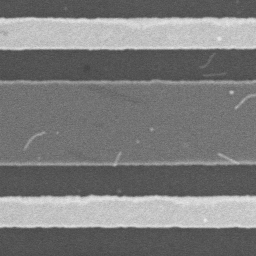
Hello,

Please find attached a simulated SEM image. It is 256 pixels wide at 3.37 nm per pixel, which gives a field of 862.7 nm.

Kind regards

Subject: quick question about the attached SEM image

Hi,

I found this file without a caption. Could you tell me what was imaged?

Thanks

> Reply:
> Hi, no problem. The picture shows lines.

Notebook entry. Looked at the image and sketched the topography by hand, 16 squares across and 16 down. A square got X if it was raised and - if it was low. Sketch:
----------------
XXXXXXXXXXXXXXXX
XXXXXXXXXXXXXXXX
----------------
----------------
XXXXXXXXXXXXXXXX
XXXXXXXXXXXXXXXX
XXXXXXXXXXXXXXXX
XXXXXXXXXXXXXXXX
XXXXXXXXXXXXXXXX
----------------
----------------
XXXXXXXXXXXXXXXX
XXXXXXXXXXXXXXXX
----------------
----------------